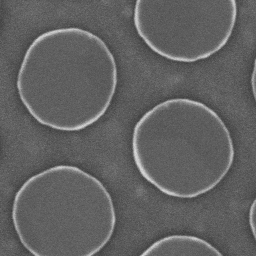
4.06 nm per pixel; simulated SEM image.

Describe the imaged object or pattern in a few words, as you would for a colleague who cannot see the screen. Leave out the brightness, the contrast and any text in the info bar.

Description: raised bodies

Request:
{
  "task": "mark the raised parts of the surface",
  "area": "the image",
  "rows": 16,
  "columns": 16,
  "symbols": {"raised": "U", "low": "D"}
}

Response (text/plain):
DDDDDDDDDUUUUUUD
DDDDDDDDDUUUUUUD
DDUUUUDDDUUUUUDD
DDUUUUUDDDUUUDDD
DUUUUUUDDDDDDDDD
DUUUUUUDDDDDDDDD
DDUUUUUDDDUUDDDD
DDUUUUDDDUUUUUDD
DDDDDDDDUUUUUUDD
DDDDDDDDUUUUUUUD
DDDDUDDDDUUUUUDD
DDUUUUDDDDUUUDDD
DUUUUUUDDDDDDDDD
DUUUUUUDDDDDDDDD
DUUUUUUDDDDDDDDD
DDUUUUDDDUUUUDDD